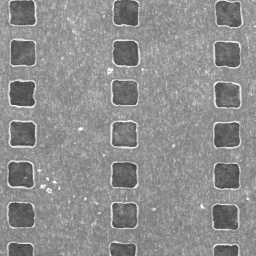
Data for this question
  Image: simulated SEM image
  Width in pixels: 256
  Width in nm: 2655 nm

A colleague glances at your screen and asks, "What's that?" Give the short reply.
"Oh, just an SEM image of a regular array of holes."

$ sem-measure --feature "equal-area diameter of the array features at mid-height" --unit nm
292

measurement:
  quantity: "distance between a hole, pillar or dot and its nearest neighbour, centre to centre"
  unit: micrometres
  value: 0.417